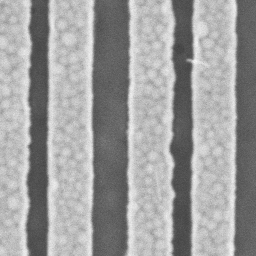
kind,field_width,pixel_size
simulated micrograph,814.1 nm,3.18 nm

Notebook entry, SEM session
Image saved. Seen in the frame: lines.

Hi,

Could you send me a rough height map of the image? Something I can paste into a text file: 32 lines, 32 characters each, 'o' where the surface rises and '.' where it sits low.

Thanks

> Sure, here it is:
oooo..oooooo....ooooo...ooooo...
oooo..oooooo....oooooo..oooooo..
oooo..oooooo....oooooo..ooooo...
oooo..ooooo.....oooooo..ooooo...
oooo..ooooo.....oooooo..ooooo...
oooo..oooooo....oooooo..ooooo...
oooo..ooooo.....ooooo...ooooo...
oooo..ooooo.....ooooo...ooooo...
oooo..ooooo.....oooooo..ooooo...
oooo..ooooo.....oooooo..ooooo...
oooo..ooooo.....oooooo..ooooo...
ooo...ooooo.....oooooo..ooooo...
ooo...ooooo.....oooooo..ooooo...
oooo..ooooo.....oooooo..ooooo...
oooo..ooooo.....oooooo..oooooo..
oooo..ooooo.....ooooo...ooooo...
oooo..oooooo....oooooo..ooooo...
oooo..oooooo....ooooo...ooooo...
oooo..oooooo....ooooo...ooooo...
oooo..ooooo.....ooooo...ooooo...
oooo..ooooo.....oooooo..ooooo...
ooo...oooooo....oooooo..ooooo...
ooo...oooooo....ooooo...ooooo...
ooo...oooooo....oooooo..ooooo...
ooo...ooooo.....oooooo..ooooo...
oooo..ooooo.....oooooo..ooooo...
ooo...ooooo.....ooooo...ooooo...
ooo...ooooo.....oooooo..ooooo...
ooo...ooooo.....oooooo..ooooo...
ooo...ooooo.....oooooo..ooooo...
ooo...ooooo.....ooooo...ooooo...
ooo...ooooo.....ooooo...ooooo...